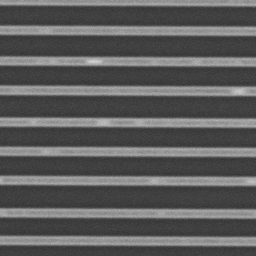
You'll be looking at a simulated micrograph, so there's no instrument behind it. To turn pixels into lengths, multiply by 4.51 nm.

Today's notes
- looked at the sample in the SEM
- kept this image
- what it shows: parallel lines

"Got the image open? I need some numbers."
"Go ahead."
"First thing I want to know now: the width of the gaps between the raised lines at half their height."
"97 nanometres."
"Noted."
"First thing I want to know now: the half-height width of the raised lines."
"33.8 nm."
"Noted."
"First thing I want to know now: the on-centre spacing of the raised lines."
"136 nm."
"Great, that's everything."